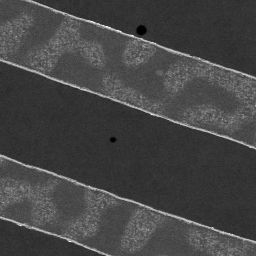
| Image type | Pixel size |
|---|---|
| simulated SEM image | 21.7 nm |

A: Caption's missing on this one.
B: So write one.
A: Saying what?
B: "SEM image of one or a few lines or trenches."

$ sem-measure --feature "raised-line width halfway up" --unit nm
1420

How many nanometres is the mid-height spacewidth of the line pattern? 1960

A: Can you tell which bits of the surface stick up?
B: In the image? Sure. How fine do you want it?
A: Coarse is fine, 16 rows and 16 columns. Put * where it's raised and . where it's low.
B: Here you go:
***.............
******..........
*********.......
************....
...************.
.....***********
........********
...........*****
..............**
................
**..............
*****...........
********........
***********.....
...***********..
......**********